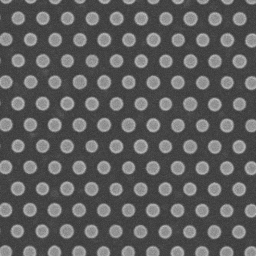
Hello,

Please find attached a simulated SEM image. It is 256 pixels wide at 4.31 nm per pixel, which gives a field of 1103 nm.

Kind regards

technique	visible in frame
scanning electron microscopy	a regular array of raised bodies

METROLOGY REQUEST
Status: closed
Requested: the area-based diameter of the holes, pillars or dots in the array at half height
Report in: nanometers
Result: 54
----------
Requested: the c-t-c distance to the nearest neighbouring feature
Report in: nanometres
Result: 105